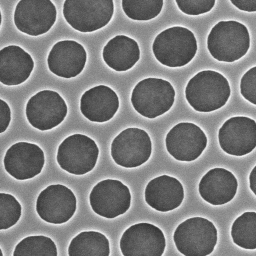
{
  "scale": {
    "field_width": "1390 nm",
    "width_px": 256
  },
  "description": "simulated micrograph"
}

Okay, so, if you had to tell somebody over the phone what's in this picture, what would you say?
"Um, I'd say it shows a regular array of holes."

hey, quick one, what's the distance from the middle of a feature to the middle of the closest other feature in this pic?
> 0.293 um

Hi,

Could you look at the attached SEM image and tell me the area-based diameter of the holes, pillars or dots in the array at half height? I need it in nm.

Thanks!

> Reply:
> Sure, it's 220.